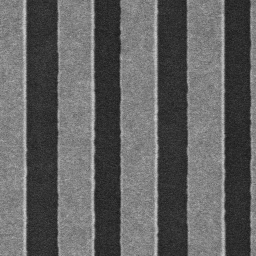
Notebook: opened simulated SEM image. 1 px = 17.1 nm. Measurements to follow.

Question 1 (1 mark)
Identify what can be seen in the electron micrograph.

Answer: lines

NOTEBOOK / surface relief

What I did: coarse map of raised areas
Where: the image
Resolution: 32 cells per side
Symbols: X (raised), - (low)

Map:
XXX----XXXXX---XXXXX---XXXXX---X
XXX----XXXXX---XXXXX---XXXXX---X
XXX----XXXXX---XXXXX---XXXXX---X
XXX----XXXXX---XXXXX---XXXXX---X
XXX----XXXXX---XXXXX---XXXXX---X
XXX----XXXXX---XXXXX---XXXXX---X
XXX----XXXXX---XXXXX---XXXXX---X
XXX----XXXXX---XXXXX---XXXXX---X
XXX----XXXXX---XXXXX---XXXXX---X
XXX----XXXXX---XXXXX---XXXXX---X
XXX----XXXXX---XXXXX---XXXXX---X
XXX----XXXXX---XXXXX---XXXXX---X
XXX----XXXXX---XXXXX----XXXX---X
XXX----XXXXX---XXXXX----XXXX---X
XXX----XXXXX---XXXXX----XXXX---X
XXX----XXXXX---XXXXX----XXXX---X
XXX----XXXXX---XXXXX----XXXX---X
XXX----XXXXX---XXXXX----XXXX---X
XXX----XXXXX---XXXXX---XXXXX---X
XXX----XXXXX---XXXXX---XXXXX---X
XXX----XXXXX---XXXXX----XXXX---X
XXX----XXXXX---XXXXX----XXXX---X
XXX----XXXXX---XXXXX---XXXXX---X
XXX----XXXXX---XXXXX----XXXX---X
XXX----XXXXX---XXXXX----XXXX---X
XXX----XXXXX---XXXXX---XXXXX---X
XXX----XXXXX---XXXXX---XXXXX---X
XXX----XXXXX---XXXXX---XXXXX---X
XXX----XXXXX---XXXXX----XXXX---X
XXX----XXXXX---XXXXX----XXXX---X
XXX----XXXXX---XXXXX----XXXX---X
XXX----XXXXX---XXXXX----XXXX---X